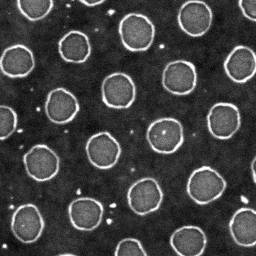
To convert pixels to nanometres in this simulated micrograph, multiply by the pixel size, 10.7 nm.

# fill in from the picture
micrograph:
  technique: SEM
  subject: a regular array of holes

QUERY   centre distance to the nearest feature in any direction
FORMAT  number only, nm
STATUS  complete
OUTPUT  637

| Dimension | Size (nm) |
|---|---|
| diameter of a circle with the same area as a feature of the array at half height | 339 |